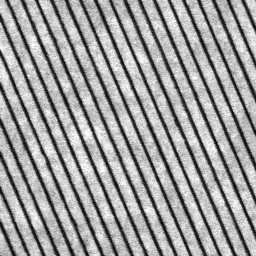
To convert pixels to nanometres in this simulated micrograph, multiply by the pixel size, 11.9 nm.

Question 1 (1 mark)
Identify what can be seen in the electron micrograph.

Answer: parallel lines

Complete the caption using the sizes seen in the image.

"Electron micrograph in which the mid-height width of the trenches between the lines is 41.1 nm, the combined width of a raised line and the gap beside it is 161 nanometres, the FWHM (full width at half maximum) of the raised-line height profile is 115 nm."